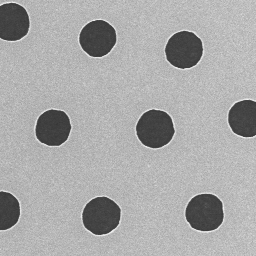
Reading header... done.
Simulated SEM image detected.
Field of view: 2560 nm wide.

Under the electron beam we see holes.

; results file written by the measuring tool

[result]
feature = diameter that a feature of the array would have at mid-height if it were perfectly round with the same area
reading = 38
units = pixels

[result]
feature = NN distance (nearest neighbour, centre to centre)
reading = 921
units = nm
